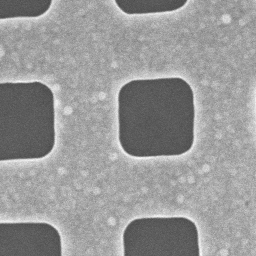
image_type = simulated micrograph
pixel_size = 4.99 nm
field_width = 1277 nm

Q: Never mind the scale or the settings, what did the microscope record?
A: holes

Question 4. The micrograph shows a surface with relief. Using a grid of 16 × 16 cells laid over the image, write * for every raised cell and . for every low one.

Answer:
...*****...*****
****************
****************
****************
****************
...*****....****
...****.....****
...****.....****
...****.....****
...*****....****
****************
****************
****************
****************
....****....****
....****....****